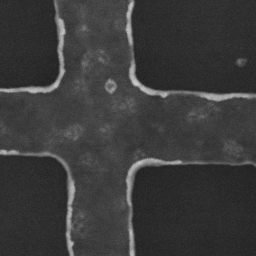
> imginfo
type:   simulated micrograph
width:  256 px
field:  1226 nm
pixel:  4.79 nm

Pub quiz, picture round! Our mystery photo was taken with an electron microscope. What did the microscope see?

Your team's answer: holes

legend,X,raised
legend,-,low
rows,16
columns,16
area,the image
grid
---XXXXX--------
----XXXX--------
----XXXX--------
----XXXX--------
----XXXX--------
-XXXXXXXX-------
XXXXXXXXXXXXXXXX
XXXXXXXXXXXXXXXX
XXXXXXXXXXXXXXXX
XXXXXXXXXXXXXXXX
----XXXXX-------
----XXXX--------
----XXXX--------
----XXXX--------
----XXXX--------
----XXXX--------